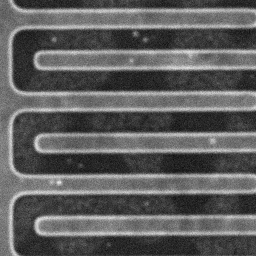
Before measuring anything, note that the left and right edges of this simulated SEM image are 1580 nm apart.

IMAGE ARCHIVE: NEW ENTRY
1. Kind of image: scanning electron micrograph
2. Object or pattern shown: groups of lines, slits or small figures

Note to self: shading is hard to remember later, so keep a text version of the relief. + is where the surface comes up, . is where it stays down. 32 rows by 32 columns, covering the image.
++..............................
++++++++++++++++++++++++++++++++
++++++++++++++++++++++++++++++++
++++............................
++..............................
+...............................
+....+++++++++++++++++++++++++++
+...++++++++++++++++++++++++++++
+....+++++++++++++++++++++++++++
+...............................
++..............................
+++.............................
++++++++++++++++++++++++++++++++
++++++++++++++++++++++++++++++++
++..............................
++..............................
+...............................
+....+++++++++++++++++++++++++++
+....+++++++++++++++++++++++++++
+...............................
++..............................
++..............................
++++++++++++++++++++++++++++++++
++++++++++++++++++++++++++++++++
++..............................
++..............................
++..............................
+....+++++++++++++++++++++++++++
+....+++++++++++++++++++++++++++
++..............................
++..............................
++..............................